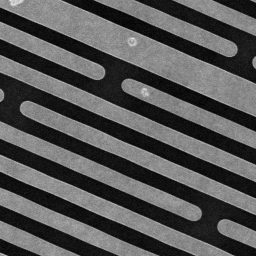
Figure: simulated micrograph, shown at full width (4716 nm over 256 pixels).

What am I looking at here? groups of lines, slits or small figures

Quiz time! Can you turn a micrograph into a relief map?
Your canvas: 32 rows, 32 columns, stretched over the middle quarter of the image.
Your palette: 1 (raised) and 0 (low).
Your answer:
11111111100000000001111111111111
00111111110000000000011111111111
00001111110000000000000111111111
00000001110000000000000001111111
00000000000000011110000000011111
11000000000000111111100000000011
11110000000000011111111100000000
11111110000000001111111111000000
11111111100000000001111111110000
01111111111000000000011111111100
00001111111111000000000111111111
00000011111111110000000001111111
00000000111111111100000000011111
10000000000111111111100000000011
11110000000001111111111000000000
11111100000000001111111110000000
11111111000000000011111111100000
01111111110000000000111111111100
00011111111110000000001111111111
00000111111111100000000001111111
00000000111111111100000000011111
10000000001111111111000000000111
11100000000011111111110000000001
11111000000000011111111110000000
11111111000000000111111111100000
11111111110000000001111111111000
00111111111100000000001111111111
00001111111111000000000011111111
00000001111111111000000000011111
00000000011111111110000000000111
11000000000011111111100000000001
11111000000000111111111100000000